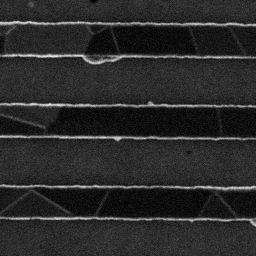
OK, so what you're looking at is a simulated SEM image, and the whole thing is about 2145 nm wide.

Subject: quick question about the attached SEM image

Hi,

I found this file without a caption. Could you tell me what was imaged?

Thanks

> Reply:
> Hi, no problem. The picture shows lines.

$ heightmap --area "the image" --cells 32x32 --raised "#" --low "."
................................
................................
................................
################################
################################
################################
################################
...........##...................
................................
................................
................................
................................
................................
################################
################################
################################
################################
................................
................................
................................
................................
................................
................................
############################.###
################################
################################
################################
............................#..#
................................
................................
................................
................................